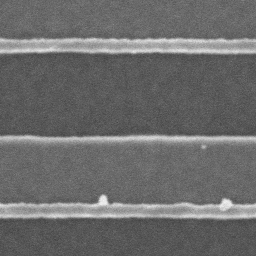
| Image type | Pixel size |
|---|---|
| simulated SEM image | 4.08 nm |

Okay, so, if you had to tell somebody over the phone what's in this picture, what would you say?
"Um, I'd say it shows lines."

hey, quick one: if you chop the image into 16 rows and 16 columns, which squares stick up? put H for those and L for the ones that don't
HHHHHHHHHHHHHHHH
HHHHHHHHHHHHHHHH
HHHHHHHHHHHHHHHH
LLLLLLLLLLLLLLLL
LLLLLLLLLLLLLLLL
LLLLLLLLLLLLLLLL
LLLLLLLLLLLLLLLL
LLLLLLLLLLLLLLLL
LLLLLLLLLLLLLLLL
HHHHHHHHHHHHHHHH
HHHHHHHHHHHHHHHH
HHHHHHHHHHHHHHHH
HHHHHHHHHHHHHHHH
HHHHHHHHHHHHHHHH
LLLLLLLLLLLLLLLL
LLLLLLLLLLLLLLLL